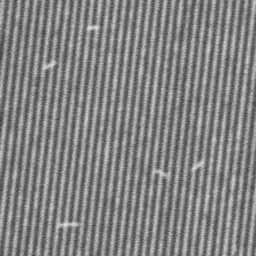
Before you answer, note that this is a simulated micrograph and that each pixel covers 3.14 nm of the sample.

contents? parallel lines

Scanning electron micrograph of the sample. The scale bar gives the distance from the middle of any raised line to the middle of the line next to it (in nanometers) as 25.3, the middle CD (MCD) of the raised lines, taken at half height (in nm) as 5.9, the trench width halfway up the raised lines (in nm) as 17.6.